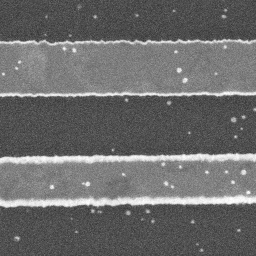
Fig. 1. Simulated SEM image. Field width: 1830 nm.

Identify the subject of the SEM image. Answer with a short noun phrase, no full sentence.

lines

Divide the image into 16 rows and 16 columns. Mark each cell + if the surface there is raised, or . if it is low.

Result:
................
................
..............+.
++++++++++++++++
++++++++++++++++
++++++++++++++++
................
................
................
................
++++++++++++++++
++++++++++++++++
++++++++++++++++
................
................
................